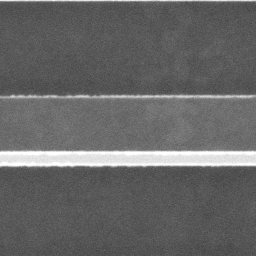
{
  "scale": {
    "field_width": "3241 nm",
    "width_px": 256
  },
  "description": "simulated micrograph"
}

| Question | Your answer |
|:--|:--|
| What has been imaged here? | lines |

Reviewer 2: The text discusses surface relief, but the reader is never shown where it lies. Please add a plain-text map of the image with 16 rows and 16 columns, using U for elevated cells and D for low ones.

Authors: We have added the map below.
DDDDDDDDDDDDDDDD
DDDDDDDDDDDDDDDD
DDDDDDDDDDDDDDDD
DDDDDDDDDDDDDDDD
DDDDDDDDDDDDDDDD
DDDDDDDDDDDDDDDD
UUUUUUUUUUUUUUUU
UUUUUUUUUUUUUUUU
UUUUUUUUUUUUUUUU
UUUUUUUUUUUUUUUU
DDDDDDDDDDDDDDDD
DDDDDDDDDDDDDDDD
DDDDDDDDDDDDDDDD
DDDDDDDDDDDDDDDD
DDDDDDDDDDDDDDDD
DDDDDDDDDDDDDDDD